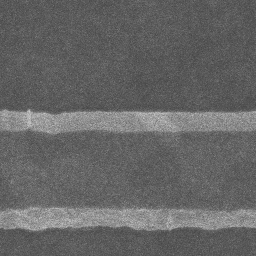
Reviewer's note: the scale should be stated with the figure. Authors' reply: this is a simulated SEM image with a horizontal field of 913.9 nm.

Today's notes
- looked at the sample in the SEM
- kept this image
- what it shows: one or a few lines or trenches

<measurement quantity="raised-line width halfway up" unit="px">101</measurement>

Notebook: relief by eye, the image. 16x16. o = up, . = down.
................
................
................
................
................
................
................
oo..ooo..o.oo..o
oooooooooooooooo
oooooooooooooooo
oooooooooooooooo
oooooooooooooooo
oooooooooooooooo
oooooooooooooooo
................
................